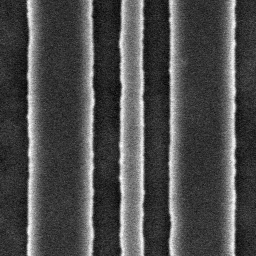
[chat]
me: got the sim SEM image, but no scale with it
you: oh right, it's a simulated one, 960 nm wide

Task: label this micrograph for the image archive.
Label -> lines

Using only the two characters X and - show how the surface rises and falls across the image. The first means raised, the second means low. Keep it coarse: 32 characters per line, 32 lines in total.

---XXXXXXXX----XXX---XXXXXXXX---
---XXXXXXXX----XXX---XXXXXXXX---
----XXXXXXX----XXX---XXXXXXXX---
----XXXXXXX----XXX---XXXXXXXX---
----XXXXXXX----XXX---XXXXXXXX---
----XXXXXXX----XXX---XXXXXXXX---
----XXXXXXXX---XXX---XXXXXXXX---
----XXXXXXXX---XXX---XXXXXXXX---
----XXXXXXX----XXX---XXXXXXXX---
---XXXXXXXXX---XXX---XXXXXXXX---
----XXXXXXX----XXX---XXXXXXXX---
----XXXXXXXX---XXX---XXXXXXXX---
---XXXXXXXXX---XXX---XXXXXXXX---
----XXXXXXXX---XXX---XXXXXXXX---
---XXXXXXXXX---XXX---XXXXXXXX---
----XXXXXXXX---XXX---XXXXXXXX---
----XXXXXXX----XXX---XXXXXXXX---
----XXXXXXX----XXX---XXXXXXXX---
----XXXXXXX----XXX---XXXXXXXX---
----XXXXXXXX---XXX---XXXXXXXX---
----XXXXXXXX---XXX---XXXXXXXX---
----XXXXXXXX---XXX---XXXXXXXX---
----XXXXXXX----XXX---XXXXXXXX---
----XXXXXXXX---XXX---XXXXXXXX---
----XXXXXXXX---XXX---XXXXXXXX---
----XXXXXXXX---XXX---XXXXXXXX---
----XXXXXXX----XXX---XXXXXXXX---
----XXXXXXX----XXX---XXXXXXXX---
---XXXXXXXXX---XXX---XXXXXXXX---
---XXXXXXXXX---XXX---XXXXXXXX---
---XXXXXXXX----XXX---XXXXXXXX---
---XXXXXXXX----XXX---XXXXXXXX---